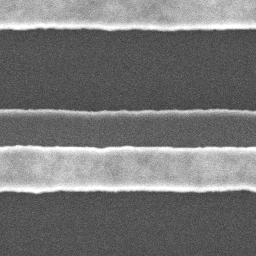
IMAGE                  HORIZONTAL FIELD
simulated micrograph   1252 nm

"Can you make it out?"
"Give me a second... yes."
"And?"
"lines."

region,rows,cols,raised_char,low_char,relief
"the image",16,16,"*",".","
****************
****************
................
................
................
................
................
****************
****************
****************
****************
****************
................
................
................
................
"